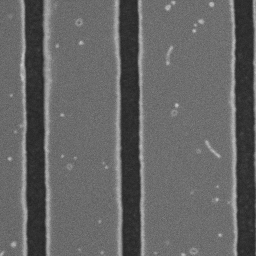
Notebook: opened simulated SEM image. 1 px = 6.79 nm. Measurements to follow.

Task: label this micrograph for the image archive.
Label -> lines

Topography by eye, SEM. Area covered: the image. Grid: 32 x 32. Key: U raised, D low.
UUUDDDUUUUUUUUUDDUUUUUUUUUUUUDDD
UUUDDUUUUUUUUUUDDUUUUUUUUUUUUDDD
UUUDDUUUUUUUUUUDDUUUUUUUUUUUUDDD
UUUDDUUUUUUUUUUDDUUUUUUUUUUUUDDD
UUUDDUUUUUUUUUUDDUUUUUUUUUUUUDDD
UUUDDUUUUUUUUUUDDUUUUUUUUUUUUDDD
UUUDDUUUUUUUUUUDDUUUUUUUUUUUUDDD
UUUDDDUUUUUUUUUDDUUUUUUUUUUUUDDD
UUUDDDUUUUUUUUUDDUUUUUUUUUUUUDDD
UUUDDDUUUUUUUUUDDUUUUUUUUUUUUDDD
UUUDDDUUUUUUUUUDDUUUUUUUUUUUUDDD
UUUDDDUUUUUUUUUDDDUUUUUUUUUUUDDD
UUUDDDUUUUUUUUUDDUUUUUUUUUUUUDDD
UUUDDDUUUUUUUUUDDUUUUUUUUUUUUDDD
UUUDDDUUUUUUUUUDDUUUUUUUUUUUUDDD
UUUDDDUUUUUUUUUDDUUUUUUUUUUUUDDD
UUUDDDUUUUUUUUUDDUUUUUUUUUUUUDDD
UUUDDDUUUUUUUUUDDUUUUUUUUUUUUUDD
UUUDDDUUUUUUUUUDDUUUUUUUUUUUUUDD
UUUDDDUUUUUUUUUDDUUUUUUUUUUUUUDD
UUUDDDUUUUUUUUUDDDUUUUUUUUUUUUDD
UUUDDDUUUUUUUUUDDDUUUUUUUUUUUUDD
UUUDDDUUUUUUUUUDDDUUUUUUUUUUUUDD
UUUDDDUUUUUUUUUDDDUUUUUUUUUUUUDD
UUUDDDUUUUUUUUUDDDUUUUUUUUUUUUDD
UUUDDDUUUUUUUUUDDDUUUUUUUUUUUUDD
UUUDDDUUUUUUUUUDDDUUUUUUUUUUUUDD
UUUDDDUUUUUUUUUDDDUUUUUUUUUUUUDD
UUUDDDUUUUUUUUUDDDUUUUUUUUUUUUDD
UUUDDDUUUUUUUUUDDDUUUUUUUUUUUUDD
UUUDDDUUUUUUUUUDDDUUUUUUUUUUUUDD
UUUDDDUUUUUUUUUDDDUUUUUUUUUUUUDD